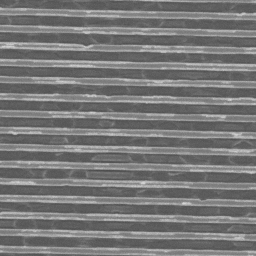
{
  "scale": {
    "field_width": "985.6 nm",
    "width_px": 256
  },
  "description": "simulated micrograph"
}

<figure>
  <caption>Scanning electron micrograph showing parallel lines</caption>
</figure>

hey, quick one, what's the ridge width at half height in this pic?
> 24.5 nm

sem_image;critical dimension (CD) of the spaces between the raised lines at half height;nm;42.3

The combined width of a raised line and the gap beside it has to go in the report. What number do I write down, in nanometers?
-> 65.3